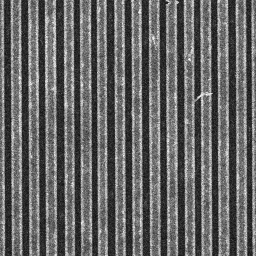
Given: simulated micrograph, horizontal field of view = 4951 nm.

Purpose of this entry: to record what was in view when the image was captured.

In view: parallel lines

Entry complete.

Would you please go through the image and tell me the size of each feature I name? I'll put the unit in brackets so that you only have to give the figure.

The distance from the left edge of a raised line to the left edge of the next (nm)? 334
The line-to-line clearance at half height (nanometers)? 164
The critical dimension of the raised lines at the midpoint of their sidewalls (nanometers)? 164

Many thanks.